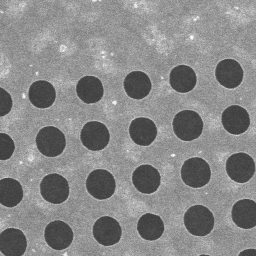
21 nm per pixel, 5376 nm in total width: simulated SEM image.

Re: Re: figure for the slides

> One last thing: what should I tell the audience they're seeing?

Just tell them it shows a regular array of holes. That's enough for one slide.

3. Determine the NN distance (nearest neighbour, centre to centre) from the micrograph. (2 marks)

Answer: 964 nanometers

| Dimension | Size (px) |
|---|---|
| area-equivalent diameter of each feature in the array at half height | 29.4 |